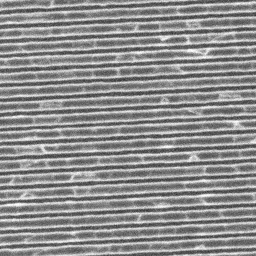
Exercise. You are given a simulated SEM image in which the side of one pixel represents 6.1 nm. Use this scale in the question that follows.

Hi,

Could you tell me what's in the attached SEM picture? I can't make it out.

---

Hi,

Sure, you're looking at parallel lines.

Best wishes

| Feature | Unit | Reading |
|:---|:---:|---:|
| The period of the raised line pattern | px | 14.7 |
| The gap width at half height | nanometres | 29.7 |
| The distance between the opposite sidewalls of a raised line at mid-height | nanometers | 59.4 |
